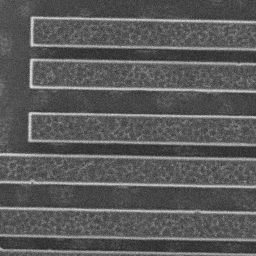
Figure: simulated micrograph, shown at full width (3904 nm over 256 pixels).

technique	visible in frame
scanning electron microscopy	parallel lines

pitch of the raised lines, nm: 738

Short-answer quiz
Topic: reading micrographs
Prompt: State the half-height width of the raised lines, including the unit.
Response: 423 nm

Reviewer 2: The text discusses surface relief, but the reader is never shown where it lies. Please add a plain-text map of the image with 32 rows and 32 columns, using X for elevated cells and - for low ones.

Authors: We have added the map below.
--------------------------------
--------------------------------
----XXXXXXXXXXXX----------------
----XXXXXXXXXXXXXXXXXXXXXXXXXXXX
----XXXXXXXXXXXXXXXXXXXXXXXXXXXX
----XXXXXXXXXXXXXXXXXXXXXXXXXXXX
--------------------------------
--------------------------------
----XXXXXXXXXXXXXXXXXXXXXXXXXXXX
----XXXXXXXXXXXXXXXXXXXXXXXXXXXX
----XXXXXXXXXXXXXXXXXXXXXXXXXXXX
--------------------------------
--------------------------------
--------------------------------
----XXXXXXXXXXXXXXXXXX----------
----XXXXXXXXXXXXXXXXXXXXXXXXXXXX
----XXXXXXXXXXXXXXXXXXXXXXXXXXXX
----XXXXXXXXXXXXXXXXXXXXXXXXXXXX
--------------------------------
XXXXXXXX------------------------
XXXXXXXXXXXXXXXXXXXXXXXXXXXXXXXX
XXXXXXXXXXXXXXXXXXXXXXXXXXXXXXXX
XXXXXXXXXXXXXXXXXXXXXXXXXXXXXXXX
--------------------------------
--------------------------------
--------------------------------
XXXXXXXXXXXXXXXXXXXXX-X-X-------
XXXXXXXXXXXXXXXXXXXXXXXXXXXXXXXX
XXXXXXXXXXXXXXXXXXXXXXXXXXXXXXXX
-----XXXXXXXXXXXXXXXXXXXXXXXXXXX
--------------------------------
XXXXXXXX---XX-------------------